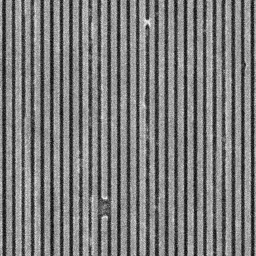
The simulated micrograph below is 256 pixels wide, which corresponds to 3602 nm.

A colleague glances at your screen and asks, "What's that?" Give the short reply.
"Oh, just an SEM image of parallel lines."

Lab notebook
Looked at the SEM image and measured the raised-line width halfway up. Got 4.88 pixels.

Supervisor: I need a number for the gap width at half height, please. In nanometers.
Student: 54.5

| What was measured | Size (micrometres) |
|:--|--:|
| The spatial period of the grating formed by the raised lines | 0.135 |